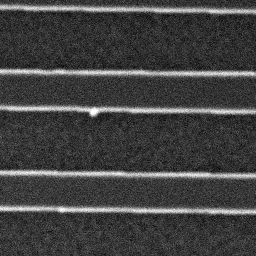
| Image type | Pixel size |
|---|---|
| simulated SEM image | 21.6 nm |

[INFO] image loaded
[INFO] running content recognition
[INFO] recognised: lines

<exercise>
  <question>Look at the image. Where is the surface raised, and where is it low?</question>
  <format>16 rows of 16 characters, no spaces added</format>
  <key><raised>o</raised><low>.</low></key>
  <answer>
oooooooooooooooo
................
................
................
ooooooooo.......
oooooooooooooooo
oooooooooooooooo
................
................
................
................
oooooooooooooooo
oooooooooooooooo
................
................
................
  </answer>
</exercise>